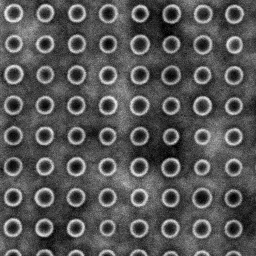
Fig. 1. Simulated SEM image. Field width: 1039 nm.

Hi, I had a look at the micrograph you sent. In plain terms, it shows a regular array of raised bodies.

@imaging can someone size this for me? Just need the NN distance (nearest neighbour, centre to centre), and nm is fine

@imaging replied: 124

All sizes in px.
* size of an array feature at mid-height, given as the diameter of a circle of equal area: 17.2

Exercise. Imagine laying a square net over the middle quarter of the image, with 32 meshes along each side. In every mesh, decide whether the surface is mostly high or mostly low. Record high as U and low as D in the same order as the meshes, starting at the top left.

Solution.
DDDDDDDDDDDDDDDDDDDDDDDDDDDDDDDD
DUUUUDDDDUUUUDDDDUUUUDDDDUUUUDDD
DUUUUDDDDUUUUDDDDUUUUDDDDUUUUDDD
DUUUUDDDDUUUUDDDDUUUUDDDDUUUUDDD
DDUUDDDDDDUUDDDDDUUUDDDDDUUUDDDD
DDDDDDDDDDDDDDDDDDDDDDDDDDDDDDDD
DDDDDDDDDDDDDDDDDDDDDDDDDDDDDDDD
DDDDDDDDDDDDDDDDDDDDDDDDDDDDDDDD
DDUUDDDDDDUUDDDDDDUUDDDDDDDDDDDD
DUUUUDDDDUUUUDDDDUUUUDDDDUUUUDDD
DUUUUDDDDUUUUDDDDUUUUDDDDUUUUDDD
DUUUUDDDDUUUUDDDDUUUUDDDDUUUUDDD
DDDDDDDDDDDDDDDDDDUUDDDDDDUDDDDD
DDDDDDDDDDDDDDDDDDDDDDDDDDDDDDDD
DDDDDDDDDDDDDDDDDDDDDDDDDDDDDDDD
DDDDDDDDDDDDDDDDDDDDDDDDDDDDDDDD
DDUUUDDDDDUUDDDDDDUUDDDDDDUUDDDD
DUUUUDDDDUUUUDDDDUUUUDDDDUUUDDDD
DUUUUDDDDUUUUDDDDUUUUDDDDUUUDDDD
DDUUDDDDDUUUDDDDDUUUDDDDDUUUDDDD
DDDDDDDDDDDDDDDDDDDDDDDDDDDDDDDD
DDDDDDDDDDDDDDDDDDDDDDDDDDDDDDDD
DDDDDDDDDDDDDDDDDDDDDDDDDDDDDDDD
DDDDDDDDDDDDDDDDDDDDDDDDDDDDDDDD
DUUUUDDDDUUUDDDDDUUUDDDDDUUUDDDD
DUUUUDDDDUUUUDDDDUUUUDDDDUUUUDDD
DUUUUDDDDUUUUDDDDUUUUDDDDUUUUDDD
DDUUDDDDDDUUDDDDDUUUDDDDDUUUDDDD
DDDDDDDDDDDDDDDDDDDDDDDDDDDDDDDD
DDDDDDDDDDDDDDDDDDDDDDDDDDDDDDDD
DDDDDDDDDDDDDDDDDDDDDDDDDDDDDDDD
DDUUDDDDDDUUDDDDDDDDDDDDDDUDDDDD